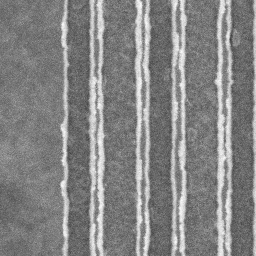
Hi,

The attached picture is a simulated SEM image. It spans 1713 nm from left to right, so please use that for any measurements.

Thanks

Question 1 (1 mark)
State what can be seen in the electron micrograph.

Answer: parallel lines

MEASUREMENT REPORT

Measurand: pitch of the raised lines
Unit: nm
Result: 286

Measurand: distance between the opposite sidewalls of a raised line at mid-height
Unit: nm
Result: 65.2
